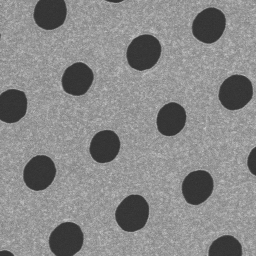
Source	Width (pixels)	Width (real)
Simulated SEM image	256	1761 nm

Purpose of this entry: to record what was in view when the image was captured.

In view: a regular array of holes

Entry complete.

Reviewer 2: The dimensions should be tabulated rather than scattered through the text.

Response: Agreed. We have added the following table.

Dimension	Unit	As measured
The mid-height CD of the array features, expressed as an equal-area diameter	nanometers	232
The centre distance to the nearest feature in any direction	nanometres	485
